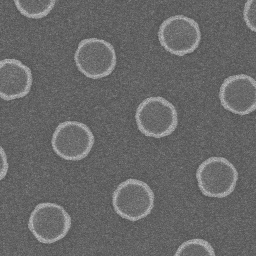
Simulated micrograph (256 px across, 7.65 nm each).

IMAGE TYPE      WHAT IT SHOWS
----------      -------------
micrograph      raised bodies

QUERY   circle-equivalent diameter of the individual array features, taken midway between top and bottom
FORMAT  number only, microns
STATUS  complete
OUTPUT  0.29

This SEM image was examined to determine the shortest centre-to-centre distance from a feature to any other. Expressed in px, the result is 85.